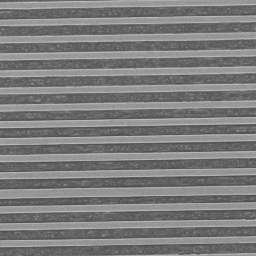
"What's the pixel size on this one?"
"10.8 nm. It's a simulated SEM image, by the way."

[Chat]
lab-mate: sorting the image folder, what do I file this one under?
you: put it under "parallel lines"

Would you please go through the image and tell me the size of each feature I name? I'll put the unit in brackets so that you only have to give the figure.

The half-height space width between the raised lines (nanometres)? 112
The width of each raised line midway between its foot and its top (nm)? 71.3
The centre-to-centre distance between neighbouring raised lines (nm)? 183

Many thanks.